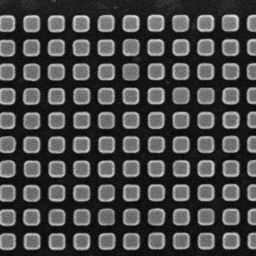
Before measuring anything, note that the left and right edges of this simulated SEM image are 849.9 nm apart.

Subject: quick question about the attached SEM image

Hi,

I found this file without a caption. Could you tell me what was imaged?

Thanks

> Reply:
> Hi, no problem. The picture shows a regular array of raised bodies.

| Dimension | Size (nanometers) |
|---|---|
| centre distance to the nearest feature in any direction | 79.9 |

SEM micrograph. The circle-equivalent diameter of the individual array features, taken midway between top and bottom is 58.8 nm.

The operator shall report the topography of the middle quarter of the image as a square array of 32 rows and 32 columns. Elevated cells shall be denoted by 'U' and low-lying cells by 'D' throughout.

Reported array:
DDUUUUDDDUUUDDDUUUDDDUUUUDDUUUUD
DDUUUUDDDUUUDDDUUUUDDUUUUDDUUUUD
DDUUUUDDDUUUDDDUUUUDDUUUUDDUUUUD
DDDUUUDDDUUUDDDUUUDDDUUUUDDDUUUD
DDDDDDDDDDDDDDDDDDDDDDDDDDDDDDDD
DDDDDDDDDDDDDDDDDDDDDDDDDDDDDDDD
DDDUUUDDDUUUDDDUUUDDDUUUUDDDUUUD
DDUUUUDDDUUUDDDUUUUDDUUUUDDUUUUD
DDUUUUDDDUUUDDDUUUUDDUUUUDDUUUUD
DDDUUUDDDUUUDDDUUUDDDUUUUDDDUUUD
DDDDDDDDDDDDDDDDDDDDDDDDDDDDDDDD
DDDDDDDDDDDDDDDDDDDDDDDDDDDDDDDD
DDDUUUDDDUUUDDDUUUDDDUUUUDDDUUUD
DDDUUUDDDUUUDDDUUUUDDUUUUDDUUUUD
DDDUUUDDDUUUDDDUUUUDDUUUUDDUUUUD
DDDUUUDDDUUUDDDUUUDDDUUUUDDUUUUD
DDDDDDDDDDDDDDDDDDDDDDDDDDDDDDDD
DDDDDDDDDDDDDDDDDDDDDDDDDDDDDDDD
DDDUUUDDDUUUDDDUUUDDDDUUUDDDUUUD
DDDUUUDDDUUUDDDUUUUDDUUUUDDUUUUD
DDDUUUDDDUUUDDDUUUUDDUUUUDDUUUUD
DDDUUUDDDUUUDDDUUUUDDUUUUDDUUUUD
DDDDDDDDDDDDDDDDDDDDDDDDDDDDDDDD
DDDDDDDDDDDDDDDDDDDDDDDDDDDDDDDD
DDDUUUDDDUUUDDDUUUDDDUUUUDDDUUUD
DDDUUUDDDUUUDDDUUUUDDUUUUDDUUUUD
DDDUUUDDDUUUDDDUUUUDDUUUUDDUUUUD
DDDUUUDDDUUUDDDUUUUDDUUUUDDUUUUD
DDDDDDDDDDDDDDDDDDDDDDDDDDDDDDDD
DDDDDDDDDDDDDDDDDDDDDDDDDDDDDDDD
DDDUUUDDDDUUDDDUUUDDDDUUUDDDUUUD
DDDUUUDDDUUUDDDUUUUDDUUUUDDUUUUD